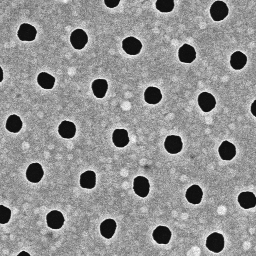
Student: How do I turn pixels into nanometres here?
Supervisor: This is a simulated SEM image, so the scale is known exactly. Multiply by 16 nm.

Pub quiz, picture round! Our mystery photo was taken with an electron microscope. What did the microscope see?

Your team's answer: a regular array of holes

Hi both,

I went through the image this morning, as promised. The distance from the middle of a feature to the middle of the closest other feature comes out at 837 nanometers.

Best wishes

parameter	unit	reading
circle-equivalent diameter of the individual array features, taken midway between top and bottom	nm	299